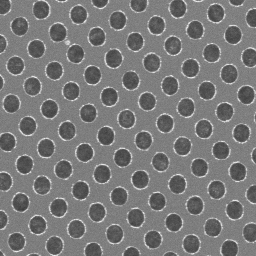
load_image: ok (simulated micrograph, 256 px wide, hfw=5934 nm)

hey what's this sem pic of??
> a regular array of holes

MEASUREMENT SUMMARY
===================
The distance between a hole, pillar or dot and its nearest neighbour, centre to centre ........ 623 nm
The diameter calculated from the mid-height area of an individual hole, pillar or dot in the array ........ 412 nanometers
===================